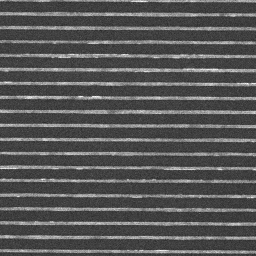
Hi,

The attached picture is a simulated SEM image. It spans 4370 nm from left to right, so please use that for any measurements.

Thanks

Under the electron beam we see parallel lines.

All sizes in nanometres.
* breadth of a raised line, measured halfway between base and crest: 42.7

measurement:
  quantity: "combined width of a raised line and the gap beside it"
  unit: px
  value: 13.9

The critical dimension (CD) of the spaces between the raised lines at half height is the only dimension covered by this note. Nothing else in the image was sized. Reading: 196 nm